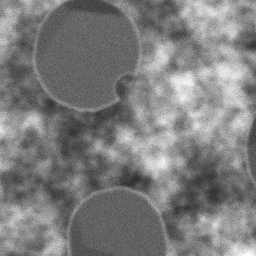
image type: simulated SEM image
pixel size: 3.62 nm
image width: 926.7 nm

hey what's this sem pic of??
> raised bodies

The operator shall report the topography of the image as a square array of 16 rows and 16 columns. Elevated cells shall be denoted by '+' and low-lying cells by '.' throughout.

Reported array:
...++++.........
...+++++........
..+++++++.......
..+++++++.......
..++++++........
...++++.........
....+++.........
................
...............+
...............+
...............+
................
.....++++.......
.....+++++......
....++++++......
....++++++......